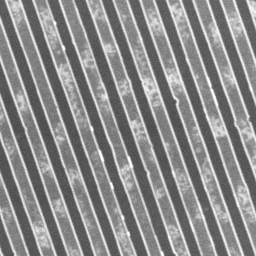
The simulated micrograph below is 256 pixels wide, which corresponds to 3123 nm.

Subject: parallel lines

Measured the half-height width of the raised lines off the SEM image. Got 154 nm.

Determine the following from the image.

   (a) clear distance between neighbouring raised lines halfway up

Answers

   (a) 154 nm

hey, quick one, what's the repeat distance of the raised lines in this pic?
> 308 nanometers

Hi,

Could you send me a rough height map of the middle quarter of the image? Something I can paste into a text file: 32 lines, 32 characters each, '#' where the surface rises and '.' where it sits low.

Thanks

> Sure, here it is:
#....###...####...###....###....
##...###....###....###...####...
##...####...####...###...####...
##....###....###...####...###...
###...####...###....###...####..
###...####...####...###....###..
####...###....###...####...###..
.###...####...###....###...####.
.###....###...####...###....###.
.####...###....###...####...###.
..###...####...###....###...####
..###....###...####...###....###
..####...###....###...####...###
...###...####...###....###...###
...###....###...####...###....##
...####...###....###...####...##
....###...###....###....###...##
#...###....###...####...###....#
#...####...###....###...####...#
#....###...####...###....###...#
##...###....###...####...###....
##...####...###....###...####...
##....###...####...###....###...
###...###....###....###...####..
###...####...####...###....###..
###....###...####...####...###..
####...####...###....###...####.
.###....###...####...###...####.
.####...###...####...####...###.
..###...####...###....###...####
..###....###...####...###...####
..####...###...####...####...###